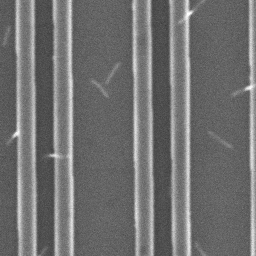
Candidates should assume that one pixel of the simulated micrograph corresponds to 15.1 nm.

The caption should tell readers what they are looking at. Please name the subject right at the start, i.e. lines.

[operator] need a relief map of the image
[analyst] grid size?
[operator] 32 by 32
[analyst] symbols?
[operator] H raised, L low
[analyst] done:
LLHHLLLHHLLLLLLLLHHLLHHLLLLLLLLH
LLHHLLLHHLLLLLLLLHHLLHHHLLLLLLLH
LLHHLLLHHLLLLLLLLHHLLHHLLLLLLLLH
LLHHLLLHHLLLLLLLLHHLLHHLLLLLLLLH
LLHHLLLHHLLLLLLLLHHLLHHLLLLLLLLH
LLHHLLLHHLLLLLLLLHHLLHHLLLLLLLLH
LLHHLLLHHLLLLLLLLHHLLHHLLLLLLLLH
LLHHLLLHHLLLLLLLLHHLLHHLLLLLLLLH
LLHHLLLHHLLLLLLLLHHLLHHLLLLLLLLH
LLHHLLLHHLLLLLLLLHHLLHHLLLLLLLLH
LLHHLLLHHLLLLLLLLHHLLHHLLLLLLLLH
LLHHLLLHHLLLLLLLLHHLLHHLLLLLLLLH
LLHHLLLHHLLLLLLLLHHLLHHLLLLLLLLH
LLHHLLLHHLLLLLLLLHHLLHHLLLLLLLLH
LLHHLLLHHLLLLLLLLHHLLHHLLLLLLLLH
LLHHLLLHHLLLLLLLLHHLLHHLLLLLLLLH
LLHHLLLHHLLLLLLLLHHLLHHHLLLLLLLH
LLHHLLLHHLLLLLLLLHHLLHHHLLLLLLLH
LLHHLLLHHLLLLLLLLHHLLHHHLLLLLLLH
LLHHLLLHHLLLLLLLLHHLLHHHLLLLLLLH
LLHHLLLHHLLLLLLLLHHLLLHHLLLLLLLH
LLHHLLLHHLLLLLLLLHHLLLHHLLLLLLLL
LLHHLLLHHLLLLLLLLHHLLLHHLLLLLLLL
LLHHLLLHHLLLLLLLLHHLLLHHLLLLLLLL
LLHHLLLHHLLLLLLLLHHLLLHHLLLLLLLL
LLHHLLLHHLLLLLLLLHHLLLHHLLLLLLLL
LLHHLLLHHLLLLLLLLHHLLLHHLLLLLLLL
LLHHLLLHHLLLLLLLLHHLLLHHLLLLLLLL
LLHHLLLHHLLLLLLLLHHLLLHHLLLLLLLL
LLHHLLLHHLLLLLLLLHHLLLHHLLLLLLLL
LLHHLLLHHLLLLLLLLHHLLLHHLLLLLLLL
LLHHLLLHHLLLLLLLLHHLLLHHLLLLLLLL